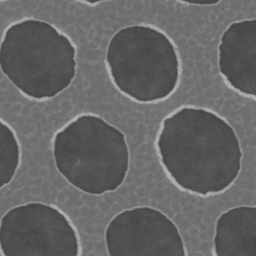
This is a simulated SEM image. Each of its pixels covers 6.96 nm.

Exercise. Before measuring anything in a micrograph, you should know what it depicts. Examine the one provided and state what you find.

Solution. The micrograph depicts holes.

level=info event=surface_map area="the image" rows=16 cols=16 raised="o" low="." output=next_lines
oooooooooooooooo
o..oooooooooooo.
....ooo....ooo..
.....oo....ooo..
.....oo....ooo..
o...ooo....oooo.
oooooooooooooooo
ooooo.oooo....oo
.ooo....oo.....o
.oo.....oo.....o
.ooo....oo.....o
ooooo..oooo...oo
oooooooooooooooo
....ooo...oooo..
.....oo....oo...
.....oo....oo...